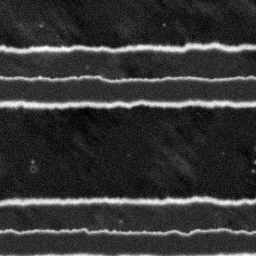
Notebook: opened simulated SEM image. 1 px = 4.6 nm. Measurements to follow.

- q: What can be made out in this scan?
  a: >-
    lines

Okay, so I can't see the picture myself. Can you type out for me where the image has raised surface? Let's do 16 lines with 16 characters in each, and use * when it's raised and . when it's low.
................
................
................
****************
****************
****************
..******..*...**
................
................
................
................
................
................
****************
****************
****************